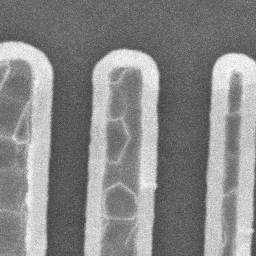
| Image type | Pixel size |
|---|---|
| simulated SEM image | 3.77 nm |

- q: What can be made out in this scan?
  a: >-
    one or a few lines or trenches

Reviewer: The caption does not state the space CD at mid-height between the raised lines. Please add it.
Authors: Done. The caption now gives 254 nm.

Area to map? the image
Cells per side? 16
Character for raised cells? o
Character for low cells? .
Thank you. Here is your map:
................
................
................
oo..............
ooo...ooo.....oo
ooo...ooo.....oo
ooo...ooo.....oo
ooo...ooo.....oo
ooo...ooo.....o.
ooo...ooo.....o.
oo....ooo.....o.
oo....ooo....oo.
oo....ooo....oo.
oo....ooo....oo.
oo....ooo....oo.
oo....ooo....oo.